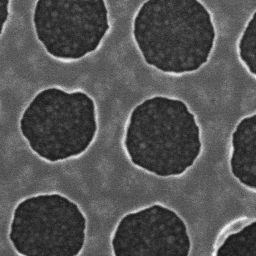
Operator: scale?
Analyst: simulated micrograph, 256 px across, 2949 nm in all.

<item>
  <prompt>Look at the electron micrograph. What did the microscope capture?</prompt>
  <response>holes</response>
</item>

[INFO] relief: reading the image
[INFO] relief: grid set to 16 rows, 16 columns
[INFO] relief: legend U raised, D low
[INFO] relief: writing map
DUDDDDDUUDDDDUUU
UUDDDDDUDDDDDUUU
UUUDDDUUDDDDDUUD
UUUDDUUUUDDDDUUD
UUUUUUUUUUDDUUUU
UUUUUUUUUUUUUUUU
UUDDDDUUUDDUUUUU
UDDDDDUUDDDDUUUD
UUDDDDUUDDDDUUUD
UUDDDUUUDDDDUUUD
UUUUUUUUUDDDUUDD
UUUUUUUUUUUUUUUD
UUDDUUUUUUUUUUUU
UDDDDUUUDDDUUUUU
UDDDDUUDDDDDUUUD
UDDDDUUDDDDDUUDD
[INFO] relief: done